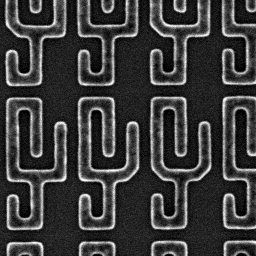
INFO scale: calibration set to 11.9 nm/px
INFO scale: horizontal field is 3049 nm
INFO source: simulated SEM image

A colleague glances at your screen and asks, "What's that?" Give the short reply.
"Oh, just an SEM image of wiring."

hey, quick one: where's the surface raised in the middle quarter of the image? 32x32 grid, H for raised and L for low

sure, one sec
LLLLHHLLLLHHLLLLLLLLLLHHHLLLHHLL
LLLLHHHLLHHHLLLLLLLLLLHHHLLHHHLL
LLLLHHHHHHHHLLLLLLLLLLHHHHHHHHLL
LLLLHHHHHHHHLLLLLLLLLLHHHHHHHHLL
LLLLHHHHHHHHLLLLLLLLLLHHHHHHHHLL
LLLLLLLLLLLLLLLLLLLLLLLLLLLLLLLL
LLLLLLLLLLLLLLLLLLLLLLLLLLLLLLLL
LLLLLLLLLLLLLLLLLLLLLLLLLLLLLLLL
LLLLHHHHHHHHLLLLLLLLLLHHHHHHHHLL
LLLLHHHHHHHHLLLLLLLLLLHHHHHHHHLL
LLLLHHHHHHHHLLLLLLLLLLHHHHHHHHLL
LLLLHHHHLHHHLLLLLLLLLLHHHLLHHHLL
LLLLHHHLLHHHHLLLLLLLLLHHHLLLHHLL
LLLLHHHLLLHHHLLLLLLLLLHHHLLLHHHL
LLLLHHHLLLHHHLLLLLLLLLHHHLLLHHHL
LLLLHHHLLLHHHLLLHHHLLLHHHLLLHHHL
HLLLHHHLLLHHHLLLHHHLLLHHHLLLHHHL
HLLLHHHLLLHHHLLLHHHLLLHHHLLLHHHL
LLLLHHHLLLHHHLLLHHHLLLHHHLLLHHHL
LLLLHHHLLLHHHLLLHHHLLLHHHLLLHHHL
LLLLHHHLLLHHHLLLHHHLLLHHHLLLHHHL
LLLLHHHLLLHHHLLLHHHLLLHHHLLLHHHL
LLLLHHHLLLHHLLLLHHHLLLHHHLLLHHLL
LLLLHHHLLLLLLLLLHHHLLLHHHLLLLLLL
LLLLHHHLLLLLLLLLHHHLLLHHHLLLLLLL
LLLLHHHLLLLLLLLHHHHLLLHHHLLLLLLL
LLLLHHHHLLLLLHHHHHLLLLHHHHHHHHLH
LLLLHHHHHHHHHHHHHHLLLLLHHHHHHHHH
LLLLHHHHHHHHHHHHHLLLLLLLHHHHHHHH
LLLLLLLLLHHHHHLLLLLLLLLLLLLHHHHL
LLLLLLLLLLHHHLLLLLLLLLLLLLLLHHHL
LLLLLLLLLLHHHLLLLLLLLLLLLLLLHHHL